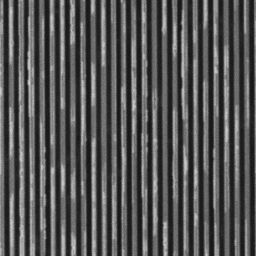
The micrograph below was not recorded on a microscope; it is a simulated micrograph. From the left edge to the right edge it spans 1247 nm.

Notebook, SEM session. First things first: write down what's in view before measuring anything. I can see parallel lines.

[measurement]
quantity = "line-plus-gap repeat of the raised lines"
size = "0.0498 µm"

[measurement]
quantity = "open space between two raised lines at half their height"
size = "0.0256 micrometres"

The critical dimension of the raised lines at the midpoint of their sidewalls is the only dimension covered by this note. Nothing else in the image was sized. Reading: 25.6 nm